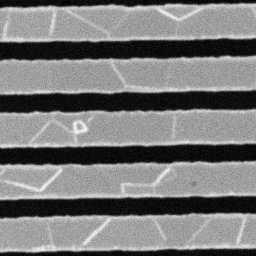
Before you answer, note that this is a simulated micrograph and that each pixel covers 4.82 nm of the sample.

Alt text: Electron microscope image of lines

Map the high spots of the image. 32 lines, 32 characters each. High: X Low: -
--------------------------------
XXXXXXXXXXXXXXXXXXXXXXXXXXXXXXXX
XXXXXXXXXXXXXXXXXXXXXXXXXXXXXXXX
XXXXXXXXXXXXXXXXXXXXXXXXXXXXXXXX
XXXXXXXXXXXXXXXXXXXXXXXXXXXXXXXX
--------------------------------
--------------------------------
-X------X-XXXXXXXXXXXXXXXXXXXXXX
XXXXXXXXXXXXXXXXXXXXXXXXXXXXXXXX
XXXXXXXXXXXXXXXXXXXXXXXXXXXXXXXX
XXXXXXXXXXXXXXXXXXXXXXXXXXXXXXXX
XXXXXXXXXX--XXX-----------------
--------------------------------
--------------------------------
XXXXXXXXXXXXXXXXXXXXXXXXXXXXXXXX
XXXXXXXXXXXXXXXXXXXXXXXXXXXXXXXX
XXXXXXXXXXXXXXXXXXXXXXXXXXXXXXXX
XXXXXXXXXXXXXXXXXXXXXXXXXXXXXXXX
--------------------------------
--------------------------------
-----------------XX--XXXXXXXXXXX
XXXXXXXXXXXXXXXXXXXXXXXXXXXXXXXX
XXXXXXXXXXXXXXXXXXXXXXXXXXXXXXXX
XXXXXXXXXXXXXXXXXXXXXXXXXXXXXXXX
XXXXXXXXXXXXXXXXXXXXXXXX-XXX----
--------------------------------
--------------------------------
XXXXXXXXXXXXXXXXXXXXXXXXXXXXXXXX
XXXXXXXXXXXXXXXXXXXXXXXXXXXXXXXX
XXXXXXXXXXXXXXXXXXXXXXXXXXXXXXXX
XXXXXXXXXXXXXXXXXXXXXXXXXXXXXXXX
--------------------------------